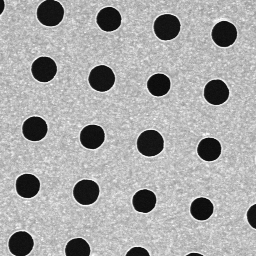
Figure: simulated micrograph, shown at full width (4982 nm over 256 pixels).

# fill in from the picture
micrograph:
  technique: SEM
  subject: a regular array of holes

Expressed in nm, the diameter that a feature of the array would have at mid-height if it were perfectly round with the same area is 494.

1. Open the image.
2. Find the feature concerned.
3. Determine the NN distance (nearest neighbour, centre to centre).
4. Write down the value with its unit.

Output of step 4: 1120 nanometers